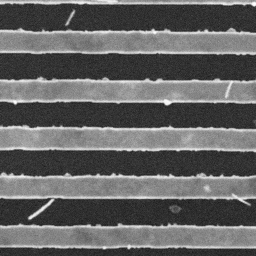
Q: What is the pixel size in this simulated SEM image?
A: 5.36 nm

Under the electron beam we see lines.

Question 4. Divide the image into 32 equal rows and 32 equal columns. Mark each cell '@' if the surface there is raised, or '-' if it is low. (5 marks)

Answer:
----------------------------@@@@
--------------------------------
--------------------------------
--------------------------------
@@@@@@@@@@@@@@@@@@@@@@@@@@@@@@@@
@@@@@@@@@@@@@@@@@@@@@@@@@@@@@@@@
@@@@@@@@@@@@@@@@@@@@@@@@@@@@@@@@
--------------------------------
--------------------------------
--------------------------------
@@@@@@@@@@@@@@@@@@@@@@@@@@@@@@@@
@@@@@@@@@@@@@@@@@@@@@@@@@@@@@@@@
@@@@@@@@@@@@@@@@@@@@@@@@@@@@@@@@
--------------------------------
--------------------------------
--------------------------------
@@@@@@@@@@@@@@@@@@@@@@@@@@@@@@@@
@@@@@@@@@@@@@@@@@@@@@@@@@@@@@@@@
@@@@@@@@@@@@@@@@@@@@@@@@@@@@@@@@
--------------------------------
--------------------------------
--------------------------------
@@@@@@@@@@@@@@@@@@@@@@@@@@@@@@@@
@@@@@@@@@@@@@@@@@@@@@@@@@@@@@@@@
@@@@@@@@@@@@@@@@@@@@@@@@@@@@@@@@
--------------------------------
--------------------------------
--------------------------------
@@@@@@@@@@@@@@@@@@@@@@@@@@@@@@@@
@@@@@@@@@@@@@@@@@@@@@@@@@@@@@@@@
@@@@@@@@@@@@@@@@@@@@@@@@@@@@@@@@
--------------------------------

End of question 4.